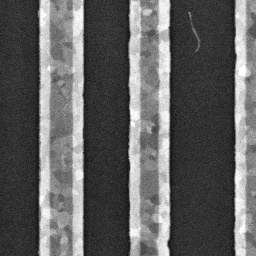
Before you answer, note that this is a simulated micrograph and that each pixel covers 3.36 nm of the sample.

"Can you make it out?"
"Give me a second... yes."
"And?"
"one or a few lines or trenches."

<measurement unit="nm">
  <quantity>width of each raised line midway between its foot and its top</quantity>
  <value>110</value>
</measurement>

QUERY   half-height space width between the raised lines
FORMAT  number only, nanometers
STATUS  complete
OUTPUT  219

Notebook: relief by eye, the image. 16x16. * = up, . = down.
...**...**.....*
...**...**.....*
...**...**.....*
...**...**.....*
...**...**.....*
...**...**.....*
...**...**.....*
...**...**.....*
...**...**.....*
...**...**.....*
...**...**.....*
...**...**.....*
...**...**.....*
...**...**.....*
...**...**.....*
...**...**.....*